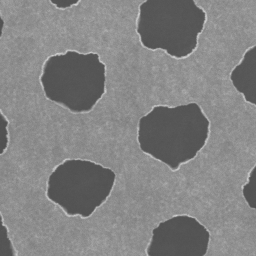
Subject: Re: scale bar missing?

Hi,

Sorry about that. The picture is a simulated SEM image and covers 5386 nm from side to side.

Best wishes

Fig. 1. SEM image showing holes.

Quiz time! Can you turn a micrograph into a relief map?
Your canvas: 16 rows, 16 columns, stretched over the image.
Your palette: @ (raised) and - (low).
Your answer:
@@@@@@@@@---@@@@
@@@@@@@@@----@@@
@@@@@@@@@---@@@@
@@@---@@@@@@@@@-
@@@----@@@@@@@@-
@@@----@@@@@@@@-
@@@@--@@@@@@@@@@
@@@@@@@@@----@@@
@@@@@@@@@----@@@
@@@@@@@@@---@@@@
@@@@---@@@@@@@@@
@@@----@@@@@@@@-
@@@---@@@@@@@@@-
@@@@@@@@@@@@@@@@
@@@@@@@@@@---@@@
-@@@@@@@@----@@@